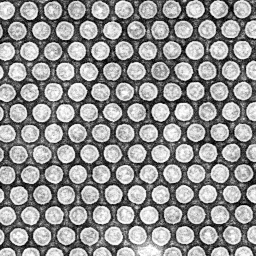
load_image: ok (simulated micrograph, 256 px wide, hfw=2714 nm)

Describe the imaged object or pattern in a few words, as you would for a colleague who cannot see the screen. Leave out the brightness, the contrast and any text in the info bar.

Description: a regular array of raised bodies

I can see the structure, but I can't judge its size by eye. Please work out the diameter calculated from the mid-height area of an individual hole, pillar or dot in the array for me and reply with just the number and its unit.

0.185 microns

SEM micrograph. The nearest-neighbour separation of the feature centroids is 23.2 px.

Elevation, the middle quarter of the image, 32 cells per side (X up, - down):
XX---XXX--XXXX--XXXX--XXXX--XXXX
XX--XXXX--XXXX--XXXX--XXXX--XXXX
XX--XXXX--XXXX--XXXX--XXXX--XXXX
XX---XXX---XX----XX----XXX---XX-
--------------------------------
--XXX---XX---XXXX--XXXX--XXXX--X
-XXXXX-XXXX--XXXX--XXXX--XXXX--X
-XXXXX-XXXX--XXXX--XXXX--XXXX--X
--XXX---XXX---XXX---XX----XXX---
--------------------------------
XX---XXX---XX----XXX---XX---XXX-
XX--XXXX--XXXX--XXXX--XXXX--XXXX
XX--XXXX--XXXX--XXXX--XXXX--XXXX
XX---XXX---XXX---XXX---XXX--XXXX
--------------------------------
--XX----XX----XX----XX----XX----
-XXXX--XXXX--XXXX--XXXX--XXXX--X
-XXXX--XXXX--XXXX--XXXX--XXXX--X
--XXX---XXX---XXX--XXXX--XXXX--X
---X----------------------------
X----XX----XX----XX-----X----XX-
XX--XXXX--XXXX--XXXX--XXXX--XXXX
XXX-XXXX--XXXX--XXXX--XXXX--XXXX
XXX-XXXX--XXXX--XXXX--XXXX--XXXX
------X-------------------------
---X----------------------XX----
--XXX---XXX--XXXX--XXXX--XXXX--X
-XXXX--XXXX--XXXX--XXXX--XXXX--X
--XXX--XXXX--XXXX--XXXX--XXXX--X
--XXX---XX----XXX----X----------
------------X-----X-------------
XX---XXX---XXX--XXXX--XXXX--XXXX